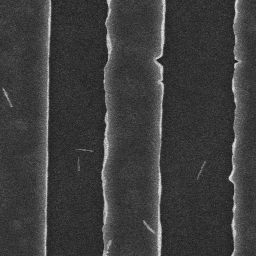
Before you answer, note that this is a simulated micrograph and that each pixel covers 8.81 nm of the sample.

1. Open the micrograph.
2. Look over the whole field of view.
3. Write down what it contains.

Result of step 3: one or a few lines or trenches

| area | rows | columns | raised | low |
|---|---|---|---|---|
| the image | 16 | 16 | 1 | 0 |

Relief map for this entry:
1110000111000001
1110000111000001
1110000111000001
1110000111000001
1110000111000001
1110000111000001
1110000111000001
1110000111000001
1110000111000001
1110000111000001
1110001111000011
1110001111000001
1110000111000001
1110000111000001
1110001111000001
1110001111000001